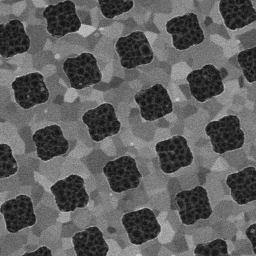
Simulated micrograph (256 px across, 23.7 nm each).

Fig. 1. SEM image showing a regular array of holes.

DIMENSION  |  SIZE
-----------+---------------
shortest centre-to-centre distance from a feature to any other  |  1290 nanometres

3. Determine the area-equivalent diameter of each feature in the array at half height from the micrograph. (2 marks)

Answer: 816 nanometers